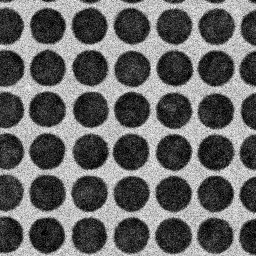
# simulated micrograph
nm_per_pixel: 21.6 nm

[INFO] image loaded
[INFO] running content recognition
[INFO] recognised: a regular array of holes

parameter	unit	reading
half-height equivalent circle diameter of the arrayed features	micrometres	0.791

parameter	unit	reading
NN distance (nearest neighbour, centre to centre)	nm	896